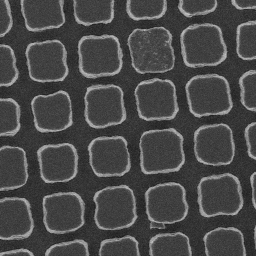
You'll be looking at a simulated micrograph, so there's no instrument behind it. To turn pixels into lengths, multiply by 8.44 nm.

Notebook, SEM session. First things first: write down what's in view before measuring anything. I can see a regular array of raised bodies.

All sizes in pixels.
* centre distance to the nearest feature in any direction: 50.4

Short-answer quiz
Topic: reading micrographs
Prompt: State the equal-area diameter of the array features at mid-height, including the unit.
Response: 358 nm